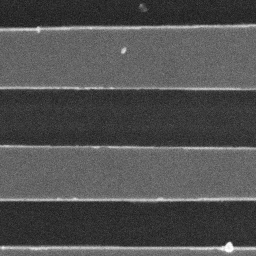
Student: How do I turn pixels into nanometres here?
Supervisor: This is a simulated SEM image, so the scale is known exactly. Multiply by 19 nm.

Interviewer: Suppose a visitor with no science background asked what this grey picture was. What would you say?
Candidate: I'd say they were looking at lines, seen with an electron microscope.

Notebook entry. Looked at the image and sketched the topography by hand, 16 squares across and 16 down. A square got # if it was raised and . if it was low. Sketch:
................
................
################
################
################
....############
................
................
................
################
################
################
................
................
................
#............##.